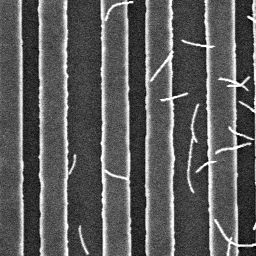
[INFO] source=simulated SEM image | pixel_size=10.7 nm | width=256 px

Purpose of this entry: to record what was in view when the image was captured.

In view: lines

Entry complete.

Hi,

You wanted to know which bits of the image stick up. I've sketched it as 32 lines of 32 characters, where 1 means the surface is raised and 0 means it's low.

11100111000001110011100000111000
11100111000001110011110000111000
11100111000001110011110000111001
11100111000001110011110000111000
11100111000001110011110000111000
11100111000001110011110000111000
11100111000001110011110000111000
11100111000001110011100000111000
11100111000001110011100000111000
11100111000001110011110000111000
11100111000001110011100000111100
11100111000001110011100000111000
11100111000001110011110000111000
11100111000001110011110000111000
11100111000001110011110000111100
11100111000001110011110000111000
11100111000001110011110000111100
11100111000001110011110000111100
11100111000001110011110000111100
11100111000001110011110000111100
11100111000001110011110000111100
11100111000001110011110000111100
11100111000001110011110000111100
11100111000001110011110000111100
11100111000001110011110000111100
11100111000001110011110000111100
11100111000001110011110000111100
11100111000001110011110000111100
11100111000001110011110000111100
11100111000001110011110000111100
11100111000001110011110000111100
11100111000001110011110000111100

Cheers